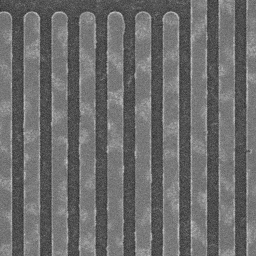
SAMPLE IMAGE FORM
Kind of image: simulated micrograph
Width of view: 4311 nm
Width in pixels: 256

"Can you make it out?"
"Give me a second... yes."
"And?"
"parallel lines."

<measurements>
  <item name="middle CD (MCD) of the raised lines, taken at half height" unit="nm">265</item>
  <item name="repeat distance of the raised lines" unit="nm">467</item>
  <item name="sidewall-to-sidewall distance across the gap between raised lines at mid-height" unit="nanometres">204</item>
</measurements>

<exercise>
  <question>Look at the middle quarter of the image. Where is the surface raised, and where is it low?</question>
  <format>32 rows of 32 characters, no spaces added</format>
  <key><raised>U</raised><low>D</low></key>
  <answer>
UDDDUUUUDDDUUUUDDDUUUUDDDUUUDDDD
UDDDUUUUDDDUUUUDDDUUUUDDDUUUDDDD
UDDDUUDUDDDUUUUDDDUUUUDDDUUUDDDD
UDDDUUUUDDDUUUUDDDUUUUDDDUUUDDDD
UDDDUUUUDDDUUUUDDDUUUUDDDUUUDDDD
UDDDUUUUDDDUUUUDDDUUUUDDDUUUDDDD
UDDDUUUUDDDUUUUDDDUUUUDDDUUUUDDD
UDDDUUUUDDDUUUUDDDUUUUDDDUUUDDDD
UDDDUUUUDDDUUUUDDDUUUUDDDUUUDDDD
UDDDUUUUDDDUUUUDDDUUUUDDDUUUUDDD
UDDDUUUUDDDUUUUDDDUUUUDDDUUUUDDD
UDDDUUUUDDDUUUUDDDUUUUDDDUUUDDDD
UDDDUUUUDDDUUUUDDDUDDUDDDUUUDDDD
UDDDUUUUDDDUUUUDDDUDDUDDDUUUDDDD
UDDDUUUUDDDUUUUDDDUUUUDDDUUUDDDD
UDDDUUUUDDDUUUUDDDUUUUDDDUUUDDDD
UDDDUUUUDDDUUUUDDDUUUUDDDUUUDDDD
UDDDUUUUDDDUUUUDDDUUUUDDDUUUDDDD
UDDDUDUUDDDUUUUDDDUUUUDDDUUUDDDD
UDDDDUUUDDDUUUUDDDUUUUDDDUUUDDDD
UDDDUUUUDDDUUUUDDDUUUUDDDUUUDDDD
UDDDUUUUDDDUUUUDDDUUUUDDDUUUDDDD
UDDDUUUUDDDUUUUDDDUUUUDDDUUUUDDD
UDDDUUUUDDDUUUUDDDUUUUDDDUUUUDDD
UDDDUUUUDDDUUUUDDDUUUUDDDUUUDDDD
UDDDUUUUDDDUUUUDDDUUUUDDDUUUUDDD
UDDDUUUUDDDUUUUDDDUUUUDDDUUUUDDD
UDDDUUUUDDDUUUUDDDUUUUDDDUUUUDDD
UDDDUUUUDDDUUUUDDDUUUUDDDUUUUDDD
UDDDUUUUDDDUUUUDDDUUUUDDDUUUUDDD
UDDDUUUUDDDUUUUDDDUUUUDDDUUUUDDD
UDDDUUUUDDDUUUUDDDUUUUDDDUUUUDDD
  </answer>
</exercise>